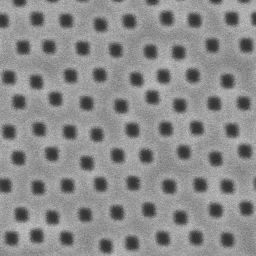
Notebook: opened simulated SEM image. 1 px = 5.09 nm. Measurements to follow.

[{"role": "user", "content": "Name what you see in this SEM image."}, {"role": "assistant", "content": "a regular array of holes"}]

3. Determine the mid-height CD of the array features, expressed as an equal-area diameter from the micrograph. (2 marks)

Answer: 78.5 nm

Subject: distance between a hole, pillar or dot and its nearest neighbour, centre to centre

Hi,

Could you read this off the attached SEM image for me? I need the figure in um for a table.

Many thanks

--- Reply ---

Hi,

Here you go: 0.139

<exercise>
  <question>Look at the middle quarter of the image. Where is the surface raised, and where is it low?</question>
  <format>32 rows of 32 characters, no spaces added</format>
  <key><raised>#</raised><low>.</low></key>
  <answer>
################################
...####...#############...#####.
...####....######..####....###..
...####....#####....###....###..
...#####..######....###....####.
#################..#############
#####################..#########
####################....########
####...#############....####..##
####....#####...#####...###....#
####....#####...###########....#
#####..######...###########....#
##############.#################
################################
################.#######..######
...############....#####...####.
...####...#####....#####...####.
...###....#####....#####...#####
...####...#######.##############
#######..#######################
############################...#
############...####...######....
############...####...######....
####...#####...####...#######...
####....####...####...##########
####....########################
#####..#########################
################################
########..######...#############
..#####....#####...######...####
...####....#####...######...####
...#####...#####...######...####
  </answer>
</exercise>